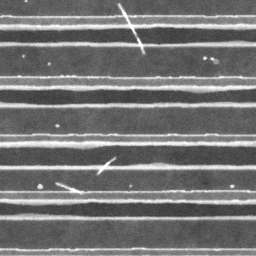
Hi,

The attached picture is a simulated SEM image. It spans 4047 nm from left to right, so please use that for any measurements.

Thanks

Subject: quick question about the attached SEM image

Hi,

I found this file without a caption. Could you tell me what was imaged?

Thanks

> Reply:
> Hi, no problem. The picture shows lines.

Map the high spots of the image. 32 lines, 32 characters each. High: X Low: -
XXXXXXXXXXXXXXXXXXXXXXXXXXXXXXXX
XXXXXXXXXXXXXXXXXXXXXXXXXXXXXXXX
XXXXXXXXXXXXXXXXXXXXXXXXXXXXXXXX
--------------------------------
--------------------------------
--------------------------------
XXXXXXXXXXXXXXXXXXXXXXXXXXXXXXXX
XXXXXXXXXXXXXXXXXXXXXXXXXXXXXXXX
XXXXXXXXXXXXXXXXXXXXXXXXXXXXXXXX
XXXXXXXXXXXXXXXXXXXXXXXXXXXXXXXX
XXXXXXXXXXXXXXXXXXXXXXXXXXXXXXXX
--------------------------------
--------------------------------
XXXXXXXXXXXXXXXXXXXXXXXXXXXXXXXX
XXXXXXXXXXXXXXXXXXXXXXXXXXXXXXXX
XXXXXXXXXXXXXXXXXXXXXXXXXXXXXXXX
XXXXXXXXXXXXXXXXXXXXXXXXXXXXXXXX
XXXXXXXXXXXXXXXXXXXXXXXXXXXXXXXX
--------------------------------
--------------------------------
--------------------------------
XXXXXXXXXXXXXXXXXXXXXXXXXXXXXXXX
XXXXXXXXXXXXXXXXXXXXXXXXXXXXXXXX
XXXXXXXXXXXXXXXXXXXXXXXXXXXXXXXX
XXXXXXXXXXXXXXXXXXXXXXXXXXXXXXXX
--------------------------------
--------------------------------
XXXXXXXXXXXXXXXXXXXXXXXXXXXXXXXX
XXXXXXXXXXXXXXXXXXXXXXXXXXXXXXXX
XXXXXXXXXXXXXXXXXXXXXXXXXXXXXXXX
XXXXXXXXXXXXXXXXXXXXXXXXXXXXXXXX
XXXXXXXXXXXXXXXXXXXXXXXXXXXXXXXX